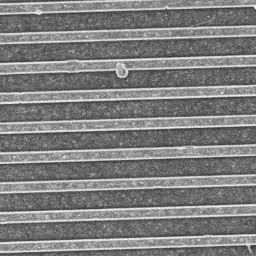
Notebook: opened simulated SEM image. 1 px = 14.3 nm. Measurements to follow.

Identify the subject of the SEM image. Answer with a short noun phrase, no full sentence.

parallel lines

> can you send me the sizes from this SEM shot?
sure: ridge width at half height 146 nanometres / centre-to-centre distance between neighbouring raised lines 426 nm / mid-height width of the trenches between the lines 0.282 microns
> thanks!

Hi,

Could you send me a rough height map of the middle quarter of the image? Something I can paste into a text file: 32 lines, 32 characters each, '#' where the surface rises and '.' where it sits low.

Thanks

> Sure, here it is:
################################
################................
.............###................
................................
................................
................................
..........######################
################################
#####################..######...
................................
................................
................................
................................
..........................######
################################
################################
############....................
................................
................................
................................
................................
...........#####################
################################
######################..........
................................
................................
................................
................................
...........................#####
################################
################################
######..........................